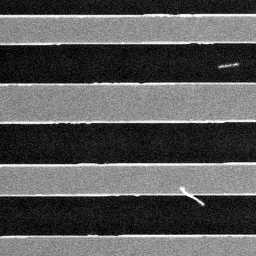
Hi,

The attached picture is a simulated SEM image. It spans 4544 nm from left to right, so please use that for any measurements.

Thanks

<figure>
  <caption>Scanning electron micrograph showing lines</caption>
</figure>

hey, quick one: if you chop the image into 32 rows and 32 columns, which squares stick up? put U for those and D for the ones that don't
DDDDDDDDDDDDDDDDDDDDDDDDDDDDDDDD
DDDDDDDDDDDDDDDDDDDDDDDDDDDDDDDD
UUUUUUUUUUUUUUUUUUUUUUUUUUUUUUUU
UUUUUUUUUUUUUUUUUUUUUUUUUUUUUUUU
UUUUUUUUUUUUUUUUUUUUUUUUUUUUUUUU
UUUUUUUDDDDDDDDDDDDDDDDDDDDDDDDD
DDDDDDDDDDDDDDDDDDDDDDDDDDDDDDDD
DDDDDDDDDDDDDDDDDDDDDDDDDDDDDDDD
DDDDDDDDDDDDDDDDDDDDDDDDDDDDDDDD
DDDDDDDDDDDDDDDDDDDDDDDDDDDDDDDD
DDDDDDDDDDDDDDDDUDUUUUUUUUUUUUUU
UUUUUUUUUUUUUUUUUUUUUUUUUUUUUUUU
UUUUUUUUUUUUUUUUUUUUUUUUUUUUUUUU
UUUUUUUUUUUUUUUUUUUUUUUUUUUUUUUU
UUUUUUUUUUUUUUUUUUUUUUUUUUUUUUUU
DDDDDDDDDDDDDDDDDDDDDDDDDDDDDDDD
DDDDDDDDDDDDDDDDDDDDDDDDDDDDDDDD
DDDDDDDDDDDDDDDDDDDDDDDDDDDDDDDD
DDDDDDDDDDDDDDDDDDDDDDDDDDDDDDDD
DDDDDDDDDDDDDDDDDDDDDDDDDDDDDDDD
DDDDDDDDDDDDDDDDDDDDDDDDDDDDUUUU
UUUUUUUUUUUUUUUUUUUUUUUUUUUUUUUU
UUUUUUUUUUUUUUUUUUUUUUUUUUUUUUUU
UUUUUUUUUUUUUUUUUUUUUUUUUUUUUUUU
DDDDDDDDDDDDDDDDDDDDDDDUDDDDDDDD
DDDDDDDDDDDDDDDDDDDDDDDDDDDDDDDD
DDDDDDDDDDDDDDDDDDDDDDDDDDDDDDDD
DDDDDDDDDDDDDDDDDDDDDDDDDDDDDDDD
DDDDDDDDDDDDDDDDDDDDDDDDDDDDDDDD
DDDDDDDDDDDDDDDUUDUUUUUUUUUUUUUU
UUUUUUUUUUUUUUUUUUUUUUUUUUUUUUUU
UUUUUUUUUUUUUUUUUUUUUUUUUUUUUUUU